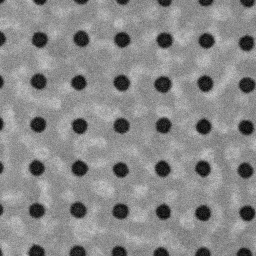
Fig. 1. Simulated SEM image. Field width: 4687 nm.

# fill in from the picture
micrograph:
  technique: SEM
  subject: a regular array of holes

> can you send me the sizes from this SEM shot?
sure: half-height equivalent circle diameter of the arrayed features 299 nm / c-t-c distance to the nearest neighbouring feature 756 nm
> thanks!